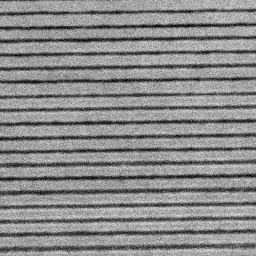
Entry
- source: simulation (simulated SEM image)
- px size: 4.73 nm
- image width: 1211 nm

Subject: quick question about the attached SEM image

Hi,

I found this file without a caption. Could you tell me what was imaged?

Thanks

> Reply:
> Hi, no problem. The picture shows parallel lines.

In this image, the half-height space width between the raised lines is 21.3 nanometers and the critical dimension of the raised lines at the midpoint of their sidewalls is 42.6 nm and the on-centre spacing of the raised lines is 65.3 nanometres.